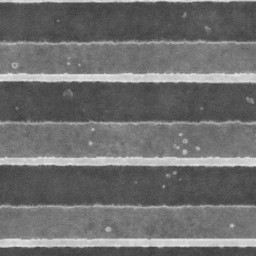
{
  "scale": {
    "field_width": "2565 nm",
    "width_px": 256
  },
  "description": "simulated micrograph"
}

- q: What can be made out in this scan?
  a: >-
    lines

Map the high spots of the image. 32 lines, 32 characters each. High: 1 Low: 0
00000000000000000000000000000000
00000000000000000000000000000000
00000000000000000000000000000000
00000000000000000000000000000000
00000000000000000000000000000000
11111111111111111111111111111111
11111111111111111111111111111111
11111111111111111111111111111111
11111111111111111111111111111111
11111111111111111111111111111111
00000000000000000000000000000000
00000000000000000000000000000000
00000000000000000000000000000000
00000000000000000000000000000000
00000000000000000000000000000000
11111111111111111111111111111111
11111111111111111111111111111111
11111111111111111111111111111111
11111111111111111111111111111111
11111111111111111111111111111111
11111111111111111111111111111111
00000000000000000000000000000000
00000000000000000000000000000000
00000000000000000000000000000000
00000000000000000000000000000000
00000000000000000000000000000000
11111111111111111111111111111111
11111111111111111111111111111111
11111111111111111111111111111111
11111111111111111111111111111111
11111111111111111111111111111111
00000000000000000000000000000000